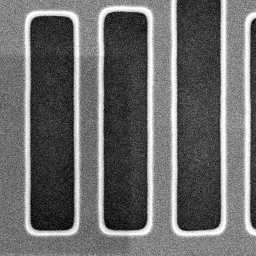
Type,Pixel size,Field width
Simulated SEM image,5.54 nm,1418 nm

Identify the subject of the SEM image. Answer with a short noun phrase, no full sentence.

groups of lines, slits or small figures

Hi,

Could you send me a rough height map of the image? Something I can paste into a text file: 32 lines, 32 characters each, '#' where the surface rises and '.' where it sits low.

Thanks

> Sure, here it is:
######################......####
#############.....####......####
####.....####......###......###.
###.......###......###......###.
###.......###......###......###.
###.......###......###......###.
###.......###......###......###.
###.......###......###......###.
####......###......###......###.
####......###......###......###.
####......###......###......###.
###.......###......###......###.
###.......###......###......###.
###.......###......###......###.
###.......###......###......###.
###.......###......###......###.
###.......###......###......###.
###.......###......###......###.
###.......###......###......###.
###.......###......###......###.
###.......###......###......###.
####......###......###......###.
####......###......###......###.
####......###......###......###.
###.......###......###......###.
###.......###......###......###.
####......###......###......###.
####......###......###......###.
####.....####.....####.....####.
################################
################################
################################